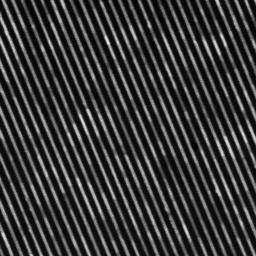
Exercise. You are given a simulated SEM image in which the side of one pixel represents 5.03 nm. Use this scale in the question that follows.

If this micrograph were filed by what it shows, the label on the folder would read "parallel lines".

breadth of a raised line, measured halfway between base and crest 0.0128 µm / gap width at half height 31.9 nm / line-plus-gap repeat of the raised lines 0.0451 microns